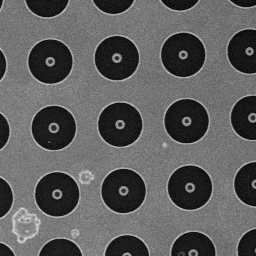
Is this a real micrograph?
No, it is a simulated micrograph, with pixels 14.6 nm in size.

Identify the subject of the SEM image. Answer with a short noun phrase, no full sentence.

an array of small figures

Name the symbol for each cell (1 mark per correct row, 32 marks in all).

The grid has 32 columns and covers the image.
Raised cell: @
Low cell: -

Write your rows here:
@@@-----@@@@-----@@@----@@@@@---
@@@@----@@@@@--@@@@@@@@@@@@@@@@@
@@@@@@@@@@@@@@@@@@@@@@@@@@@@@@@@
@@@@@@@@@@@@@@@@@@@@@@@@@@@@@@@@
@@@@@@@@@@@@@@-@@@@@@---@@@@@---
@@@@@---@@@@-----@@@-----@@@@---
@@@@-----@@@-----@@@------@@----
-@@---@--@@@--@--@@@------@@@---
-@@@-----@@@-----@@@@----@@@@---
@@@@----@@@@@---@@@@@@--@@@@@@@@
@@@@@@-@@@@@@@@@@@@@@@@@@@@@@@@@
@@@@@@@@@@@@@@@@@@@@@@@@@@@@@@@@
@@@@@@@@@@@@@@@@@@@@@@--@@@@@@--
@@@@@@--@@@@@----@@@@-----@@@---
@@@@-----@@@------@@@-----@@@--@
-@@@-----@@@------@@@-----@@@---
-@@@-----@@@------@@@-----@@@---
-@@@-----@@@@----@@@@@---@@@@@@-
@@@@@---@@@@@@@@@@@@@@@@@@@@@@@@
@@@@@@@@@@@@@@@@@@@@@@@@@@@@@@@@
@@@@@@@@@@@@@@@@@@@@@@@@@@@@@@@-
@@@@@@@-@@@@@@---@@@@@----@@@@--
-@@@@----@@@@-----@@@-----@@@---
-@@@------@@@-----@@@--@---@@---
--@@------@@@-----@@@-----@@@@--
--@@@-----@@@-----@@@@----@@@@@-
-@@@@----@@@@@--@@@@@@@@@@@@@@@@
@@@@@@@@@@@@@@@@@@@@@@@@@@@@@@@@
@@@@@@@@@@@@@@@@@@@@@@@@@@@@@@@@
@@@@@@@@@@@@@@@--@@@@@----@@@@--
-@@@@@---@@@@@----@@@@-----@@@--
--@@@-----@@@------@@------@@@--